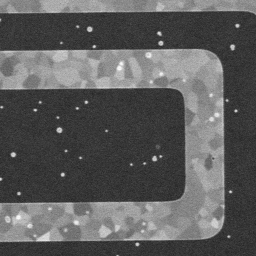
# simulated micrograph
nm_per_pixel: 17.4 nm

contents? groups of lines, slits or small figures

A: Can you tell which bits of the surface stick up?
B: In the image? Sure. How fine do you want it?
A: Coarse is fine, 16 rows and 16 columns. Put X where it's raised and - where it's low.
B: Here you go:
XXXXXXXXXXXXXXXX
----------------
----------------
XXXXXXXXXXXXX---
XXXXXXXXXXXXXX--
XXXXX-----XXXX--
------------XX--
------------XX--
------------XX--
------------XX--
------------XX--
------------XX--
-----------XXX--
XXXXXXXXXXXXXX--
XXXXXXXXXXXXXX--
----------------